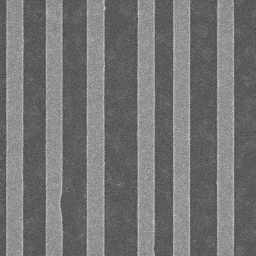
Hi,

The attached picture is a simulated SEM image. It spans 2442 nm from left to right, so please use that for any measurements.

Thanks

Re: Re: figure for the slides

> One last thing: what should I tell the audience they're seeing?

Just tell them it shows parallel lines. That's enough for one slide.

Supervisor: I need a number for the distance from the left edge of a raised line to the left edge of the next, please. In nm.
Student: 402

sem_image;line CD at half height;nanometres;155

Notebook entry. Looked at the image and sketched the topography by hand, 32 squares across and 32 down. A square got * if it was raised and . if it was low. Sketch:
.**...**...**....**...**...**...
.**...**...**....**...**...**...
.**...**.*.**....**...**...**...
.**...**...**....**...**.*.**...
.**...**...**....***..**...**...
.**...**...**....***..**...**...
.**...**...**....**...**.*.**...
.**...**...**....**...**...**...
.**...**...**....**...**...**...
.**...**...**....**...**...**...
.**...**...**....***..**...**...
.**...**...**....**...**...**...
.**...**...**....**...**...**...
.**...**...**....**...**...**...
.**...**...**....**...**...**...
.**...**...**....**...**...**...
.**...**...**....**...**...**...
.**...**...**....**...**...**...
.**...**...**....**...**...**...
.**...**...**....**...**...**...
.**...**...**....**...**...**...
.**...**...**....**...**...**...
.**...**...**....**...**...**...
.**...**...**....**...**...**...
.**...**...**....**...**...***..
.**...*....**....**...**...**...
.**...**...**....**...**...**...
.**...**...**....**...**...**...
.**...**...**....**...**...**...
.**...**...**....**...**...**...
.**...**...**....**...**...**...
.**...**...**....**...**...****.